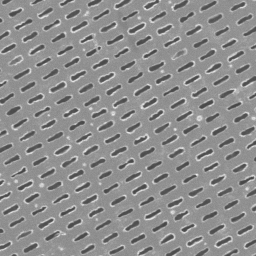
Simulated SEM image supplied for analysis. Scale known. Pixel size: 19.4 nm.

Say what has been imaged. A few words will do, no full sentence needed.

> a regular array of holes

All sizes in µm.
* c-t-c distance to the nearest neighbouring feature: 0.274